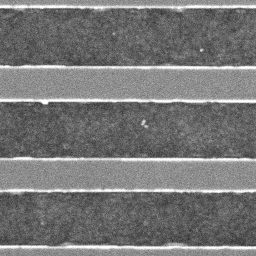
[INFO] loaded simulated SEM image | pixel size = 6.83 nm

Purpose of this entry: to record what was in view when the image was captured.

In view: lines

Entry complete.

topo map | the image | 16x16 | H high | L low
LLLLLHHLHLHHLLLL
LLLLLLLLLLLLLLLL
LLLLLLLLLLLLLLLL
LLLLLLLLLLLLLLLL
HHHHHHHHHHHHHHHH
HHHHHHHHHHHHHHHH
LLLLLLLLLLLLLLLL
LLLLLLLLLLLLLLLL
LLLLLLLLLLLLLLLL
LLLLLLLLLLLLLLLL
HHHHHHHHHHHHHHHH
HHHHHHHHHHHHHHHH
LLLLLLLLLLLLLLLL
LLLLLLLLLLLLLLLL
LLLLLLLLLLLLLLLL
HHHHHHHHHHHHHHHH